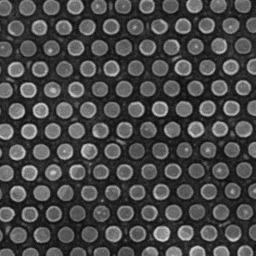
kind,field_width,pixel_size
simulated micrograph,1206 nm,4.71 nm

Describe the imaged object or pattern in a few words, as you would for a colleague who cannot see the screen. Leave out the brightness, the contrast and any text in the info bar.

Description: a regular array of raised bodies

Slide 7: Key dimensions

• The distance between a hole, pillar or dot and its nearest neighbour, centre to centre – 111 nanometers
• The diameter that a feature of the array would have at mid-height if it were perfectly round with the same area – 15.6 px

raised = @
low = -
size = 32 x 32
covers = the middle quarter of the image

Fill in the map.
@@--@@@@--@@@@--@@@@--@@@@--@@@@
@@--@@@@--@@@@--@@@@--@@@@--@@@@
@@---@@@---@@----@@----@@---@@@-
--------------------------------
--------------------@@----@@----
-@@@@--@@@@--@@@@--@@@@--@@@@--@
-@@@@--@@@@--@@@@--@@@@--@@@@--@
--@@@---@@@--@@@@---@@----@@----
--------------------------------
-----------------------------@@-
@@--@@@@--@@@@--@@@@--@@@@--@@@@
@@--@@@@--@@@@--@@@@--@@@@--@@@@
@@--@@@@---@@@---@@@---@@----@@@
--------------------------------
--------------------------------
--@@---@@@@---@@@--@@@@--@@@@--@
-@@@@--@@@@--@@@@--@@@@--@@@@--@
-@@@@--@@@@--@@@@--@@@@--@@@@---
---------------@----------------
--------------------------------
@@---@@----@@@---@@@--@@@@---@@@
@@---@@@--@@@@--@@@@--@@@@--@@@@
@@---@@@--@@@@---@@@--@@@@--@@@@
@----@@----@@-----@----@@-------
--------------------------------
--@@@---@@----@@@---@@@---@@@---
--@@@--@@@@--@@@@---@@@--@@@@--@
--@@@--@@@@--@@@@---@@@--@@@@---
--@@@---@@----@@----@@----@@----
--------------------------------
------------------@----@@@---@@-
@@---@@@---@@@--@@@@--@@@@--@@@@